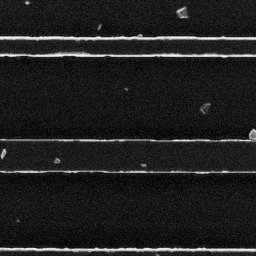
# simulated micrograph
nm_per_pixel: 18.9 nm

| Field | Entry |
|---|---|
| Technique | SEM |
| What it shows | lines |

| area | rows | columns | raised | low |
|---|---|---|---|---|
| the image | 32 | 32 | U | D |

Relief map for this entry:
DDDDDDDDDDDDDDDDDDDDDDDDDDDDDDDD
DDDDDDDDDDDDDDDDDDDDDDDDDDDDDDDD
DDDDDDDDDDDDDDDDDDDDDDDDDDDDDDDD
DDDDDDDDDDDDDDDDDDDDDDDDDDDDDDDD
DDDDDDDDDDDDDDDDDDDDDDDDDDDDDDDD
UUUUUUUUUUUUUUUUUUUUUUUUUUUUUUUU
UUUUUUUUUUUUUUUUUUUUUUUUUUUUUUUU
DDDDDDDDDDDDDDDDDDDDDDDDDDDDDDDD
DDDDDDDDDDDDDDDDDDDDDDDDDDDDDDDD
DDDDDDDDDDDDDDDDDDDDDDDDDDDDDDDD
DDDDDDDDDDDDDDDDDDDDDDDDDDDDDDDD
DDDDDDDDDDDDDDDDDDDDDDDDDDDDDDDD
DDDDDDDDDDDDDDDDDDDDDDDDDDDDDDDD
DDDDDDDDDDDDDDDDDDDDDDDDDDDDDDDD
DDDDDDDDDDDDDDDDDDDDDDDDDDDDDDDD
DDDDDDDDDDDDDDDDDDDDDDDDDDDDDDDD
DDDDDDDDDDDDDDDDDDDDDDDDDDDDDDDD
UDDDDDDDDDDDDDDDDDDDDDDDDDDDDDDD
UUUUUUUUUUUUUUUUUUUUUUUUUUUUUUUU
UUUUUUUUUUUUUUUUUUUUUUUUUUUUUUUU
UUUUUUUUUUUUUUUUUUUUUUUUUUUUUUUU
DDDDDDDDDDDDDDDDDDDDDDDDUUDDDDDD
DDDDDDDDDDDDDDDDDDDDDDDDDDDDDDDD
DDDDDDDDDDDDDDDDDDDDDDDDDDDDDDDD
DDDDDDDDDDDDDDDDDDDDDDDDDDDDDDDD
DDDDDDDDDDDDDDDDDDDDDDDDDDDDDDDD
DDDDDDDDDDDDDDDDDDDDDDDDDDDDDDDD
DDDDDDDDDDDDDDDDDDDDDDDDDDDDDDDD
DDDDDDDDDDDDDDDDDDDDDDDDDDDDDDDD
DDDDDDDDDDDDDDDDDDDDDDDDDDDDDDDD
DDDDDDDDDDDDDDDDDDDDDDDDDDDDDDDD
UUUUUUUUUUUUUUUUUUUUUUUUUUUUUUUU